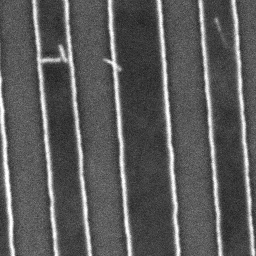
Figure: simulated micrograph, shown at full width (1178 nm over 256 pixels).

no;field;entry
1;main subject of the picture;lines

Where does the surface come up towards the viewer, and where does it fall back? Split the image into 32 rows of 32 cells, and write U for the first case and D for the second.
DDDDUUUUDDDDDDUUUUUUDDDDDUUUUDDD
DDDDUUUUDDDDDDUUUUUUDDDDDUUUUDDD
DDDDUUUUDDDDDDUUUUUUDDDDDUUUUUDD
DDDDUUUUUDDDDDUUUUUUDDDDDUUUUUDD
DDDDDUUUUDDDDDUUUUUUDDDDDUUUUUDD
DDDDDUUUUDDDDDUUUUUUDDDDDUUUUUDD
DDDDDUUUUDDDDDUUUUUUDDDDDUUUUUDD
DDDDDUUUUDDDDDUUUUUUUDDDDDUUUUDD
DDDDDUUUUDDDDDUUUUUUUDDDDDUUUUDD
DDDDDUUUUDDDDDUUUUUUUDDDDDUUUUDD
DDDDDUUUUDDDDDDUUUUUUDDDDDUUUUDD
DDDDDUUUUDDDDDDUUUUUUDDDDDUUUUDD
DDDDDUUUUDDDDDDUUUUUUDDDDDUUUUDD
DDDDDUUUUUDDDDDUUUUUUDDDDDUUUUDD
DDDDDUUUUUDDDDDUUUUUUDDDDDUUUUDD
DDDDDDUUUUDDDDDUUUUUUDDDDDUUUUUD
UDDDDDUUUUDDDDDUUUUUUDDDDDUUUUUD
UDDDDDUUUUDDDDDUUUUUUDDDDDUUUUUD
UDDDDDUUUUDDDDDUUUUUUDDDDDDUUUUD
UDDDDDUUUUDDDDDUUUUUUDDDDDDUUUUD
UDDDDDUUUUDDDDDUUUUUUDDDDDDUUUUD
UDDDDDUUUUDDDDDUUUUUUUDDDDDUUUUD
UDDDDDUUUUDDDDDUUUUUUUDDDDDUUUUD
UDDDDDUUUUDDDDDUUUUUUUDDDDDUUUUD
UDDDDDUUUUUDDDDDUUUUUUDDDDDUUUUD
UDDDDDUUUUUDDDDDUUUUUUDDDDDUUUUD
UDDDDDUUUUUDDDDDUUUUUUDDDDDUUUUD
UDDDDDUUUUUDDDDDUUUUUUDDDDDUUUUD
UDDDDDDUUUUDDDDDUUUUUUDDDDDUUUUD
UDDDDDDUUUUDDDDDUUUUUUDDDDDUUUUU
UDDDDDDUUUUDDDDDUUUUUUDDDDDUUUUU
UUDDDDDUUUUDDDDDUUUUUUDDDDDUUUUU